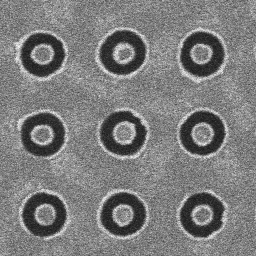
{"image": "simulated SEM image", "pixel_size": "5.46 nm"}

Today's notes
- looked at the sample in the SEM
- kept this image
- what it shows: a regular array of ring-shaped grooves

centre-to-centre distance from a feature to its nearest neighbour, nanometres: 434